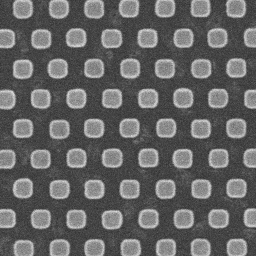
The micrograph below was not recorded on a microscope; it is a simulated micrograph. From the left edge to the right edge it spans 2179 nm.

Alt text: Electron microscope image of a regular array of raised bodies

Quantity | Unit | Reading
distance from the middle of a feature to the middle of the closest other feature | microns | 0.293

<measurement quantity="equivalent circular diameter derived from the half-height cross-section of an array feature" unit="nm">168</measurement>